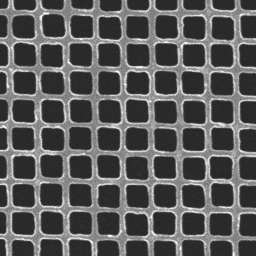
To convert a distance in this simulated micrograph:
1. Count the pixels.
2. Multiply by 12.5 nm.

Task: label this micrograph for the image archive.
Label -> a regular array of holes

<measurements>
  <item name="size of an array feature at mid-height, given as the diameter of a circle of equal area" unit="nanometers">310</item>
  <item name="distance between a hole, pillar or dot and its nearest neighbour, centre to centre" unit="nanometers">344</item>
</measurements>